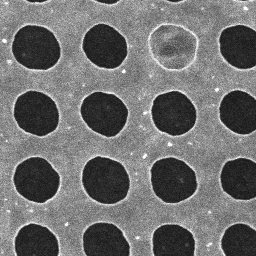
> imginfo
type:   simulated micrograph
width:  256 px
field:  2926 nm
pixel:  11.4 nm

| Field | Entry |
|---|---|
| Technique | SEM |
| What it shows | a regular array of holes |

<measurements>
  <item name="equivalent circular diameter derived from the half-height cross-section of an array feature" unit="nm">522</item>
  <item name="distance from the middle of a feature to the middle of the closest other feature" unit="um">0.761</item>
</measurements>